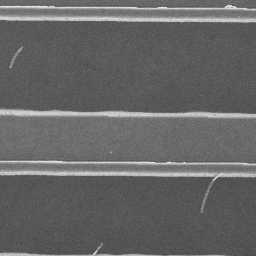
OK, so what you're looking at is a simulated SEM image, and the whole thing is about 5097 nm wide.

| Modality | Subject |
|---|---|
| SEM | lines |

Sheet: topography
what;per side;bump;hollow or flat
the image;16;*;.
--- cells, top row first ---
****************
................
................
................
................
................
................
****************
****************
****************
****************
................
................
................
................
................